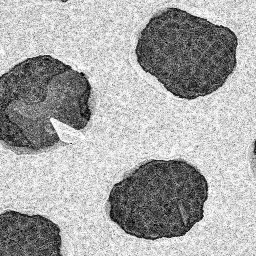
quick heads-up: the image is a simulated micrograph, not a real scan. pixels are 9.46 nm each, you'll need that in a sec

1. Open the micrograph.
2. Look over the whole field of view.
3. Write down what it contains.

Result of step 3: holes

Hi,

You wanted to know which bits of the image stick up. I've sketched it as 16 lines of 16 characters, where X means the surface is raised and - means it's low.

XXXXXXXXXXXXXXXX
XXXXXXXXX----XXX
XXXXXXXXX------X
XX-XXXXXX------X
-----XXXX------X
------XXXX----XX
------XXXXXXXXXX
------XXXXXXXXXX
----XXXXXXXXXXXX
X--XXXXXXXXXXXXX
XXXXXXXX----XXXX
XXXXXXX------XXX
XXXXXXX------XXX
---XXXX------XXX
----XXXX----XXXX
----XXXXXXXXXXXX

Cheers